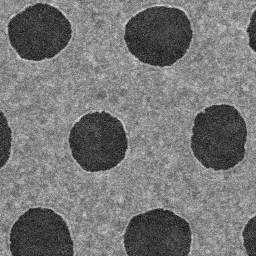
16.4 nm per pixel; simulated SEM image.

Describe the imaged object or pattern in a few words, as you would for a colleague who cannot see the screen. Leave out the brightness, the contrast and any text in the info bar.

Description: holes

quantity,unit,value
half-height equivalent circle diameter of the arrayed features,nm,1000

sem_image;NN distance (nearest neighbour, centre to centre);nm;1940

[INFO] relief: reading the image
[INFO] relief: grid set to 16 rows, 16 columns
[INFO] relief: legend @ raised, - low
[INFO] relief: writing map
@@--@@@@@--@@@@@
@---@@@@----@@@@
@---@@@@----@@@@
@--@@@@@---@@@@@
@@@@@@@@@@@@@@@@
@@@@@@@@@@@@@@@@
@@@@@@@@@@@@@@@@
@@@@@--@@@@@---@
-@@@----@@@@---@
-@@@----@@@@---@
@@@@@--@@@@@@-@@
@@@@@@@@@@@@@@@@
@@@@@@@@@@@@@@@@
@---@@@@---@@@@@
@---@@@@----@@@-
@----@@@----@@@-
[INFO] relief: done